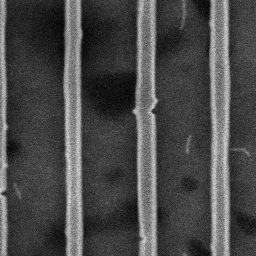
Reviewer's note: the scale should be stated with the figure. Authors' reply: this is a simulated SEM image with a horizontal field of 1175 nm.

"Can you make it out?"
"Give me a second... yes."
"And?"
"one or a few lines or trenches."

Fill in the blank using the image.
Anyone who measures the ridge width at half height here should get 64.5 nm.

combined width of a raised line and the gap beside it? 336 nanometers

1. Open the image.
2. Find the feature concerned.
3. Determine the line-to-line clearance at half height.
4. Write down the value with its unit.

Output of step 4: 272 nm